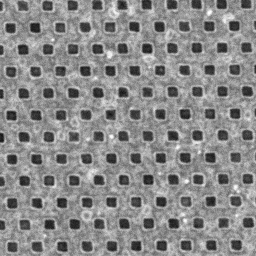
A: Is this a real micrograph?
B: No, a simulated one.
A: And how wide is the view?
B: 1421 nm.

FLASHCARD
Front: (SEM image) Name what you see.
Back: a regular array of holes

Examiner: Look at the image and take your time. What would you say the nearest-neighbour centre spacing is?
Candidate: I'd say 0.136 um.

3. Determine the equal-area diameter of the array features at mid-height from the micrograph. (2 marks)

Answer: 0.0676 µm